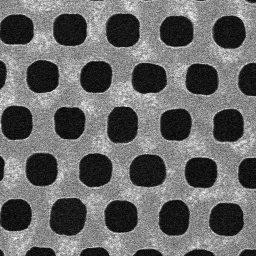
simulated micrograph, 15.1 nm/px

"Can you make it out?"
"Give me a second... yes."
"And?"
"a regular array of holes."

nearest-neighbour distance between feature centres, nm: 793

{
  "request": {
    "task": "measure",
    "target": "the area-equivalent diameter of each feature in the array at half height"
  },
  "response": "513 nanometers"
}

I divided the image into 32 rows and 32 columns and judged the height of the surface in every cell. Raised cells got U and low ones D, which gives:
UUUUUUUUUUUUUUUUUUUUUUUUUUUUUUUU
UUUUUUUUUUUUUUUUUUUUUUUUUUUUUUUU
DDDDUUUDDDDUUUDDDUUUDDDDUUUDDDUU
DDDDUUUDDDDUUDDDDUUUDDDDUUUDDDDU
DDDDUUUDDDDUUDDDDUUUDDDDUUUDDDDU
UDDUUUUUDDUUUUDDDUUUUDDUUUUDDDUU
UUUUUUUUUUUUUUUUUUUUUUUUUUUUUUUU
UUUUUUUUUUUUUUUUUUUUUUUUUUUUUUUU
DUUDDDDUUUDDDDUUUDDDUUUUDDDUUUDD
DUUDDDDUUUDDDDUUDDDDDUUDDDDUUUDD
DUUDDDDUUUDDDDUUUDDDDUUDDDDUUUDD
UUUUDDUUUUUDDUUUUDDDUUUUDDDUUUDD
UUUUUUUUUUUUUUUUUUUUUUUUUUUUUUUU
UDDUUUUUDDUUUUDDUUUUUUUUUUUUUUUU
DDDDUUUDDDDUUUDDDUUUDDDDUUUDDDUU
DDDDUUUDDDDUUDDDDUUUDDDDUUUDDDUU
DDDDUUUDDDUUUDDDDUUUDDDDUUUDDDUU
UUUUUUUUUUUUUUDDUUUUUDDUUUUDDDUU
UUUUUUUUUUUUUUUUUUUUUUUUUUUUUUUU
UUUUDDDUUUUDDUUUUDDDUUUUUUUUUUUU
DUUDDDDUUUDDDDUUDDDDUUUDDDDUUUDD
DUUDDDDUUUDDDDUUDDDDDUUDDDDUUUDD
UUUUDDDUUUDDDDUUDDDDDUUDDDDUUUDD
UUUUUUUUUUUUUUUUUUUUUUUUUUUUUUUD
UUUUUUUUUUUUUUUUUUUUUUUUUUUUUUUU
DDDDUUUDDDUUUUDDDUUUUDDUUUUDDDUU
DDDDUUDDDDDUUDDDDUUUDDDDUUDDDDUU
DDDDUUDDDDDUUDDDDUUUDDDDUUDDDDUU
DDDUUUDDDDUUUUDDDUUUDDDUUUDDDDUU
UUUUUUUUUUUUUUUUUUUUUUUUUUUUDUUU
UUUUUUUUUUUUUUUUUUUUUUUUUUUUUUUU
UUUDDDDUUUDDDUUUUDDDUUUUDDUUUUDD